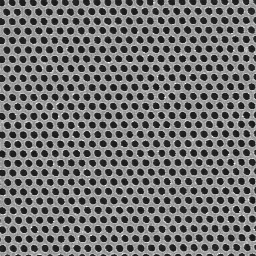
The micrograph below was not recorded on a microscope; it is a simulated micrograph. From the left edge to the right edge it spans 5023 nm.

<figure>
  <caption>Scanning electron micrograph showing a regular array of holes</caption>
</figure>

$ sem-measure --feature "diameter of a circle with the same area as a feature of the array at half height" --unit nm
140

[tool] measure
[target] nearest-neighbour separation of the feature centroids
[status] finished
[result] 205 nm